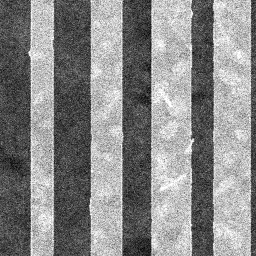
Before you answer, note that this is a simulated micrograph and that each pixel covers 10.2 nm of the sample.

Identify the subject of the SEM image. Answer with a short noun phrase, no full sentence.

one or a few lines or trenches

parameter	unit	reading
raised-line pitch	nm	651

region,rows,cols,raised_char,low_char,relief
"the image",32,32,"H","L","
LLLLHHHLLLLHHHHLLLLHHHHHLLLHHHHL
LLLLHHHLLLLHHHHLLLLHHHHHLLLHHHHL
LLLLHHHLLLLHHHHLLLLHHHHHLLLHHHHL
LLLLHHHLLLLHHHHLLLLHHHHHLLLHHHHL
LLLLHHHLLLLHHHHLLLLHHHHHLLLHHHHL
LLLLHHLLLLLHHHHLLLLHHHHHLLLHHHHL
LLLLHHHLLLLHHHHLLLLHHHHHLLLHHHHL
LLLLHHHLLLLHHHHLLLLHHHHHLLLHHHHL
LLLLHHHLLLLHHHHLLLLHHHHHLLLHHHHL
LLLLHHHLLLLHHHHLLLLHHHHHLLLHHHHL
LLLLHHHLLLLHHHHLLLLHHHHHLLLHHHHL
LLLLHHHLLLLHHHHLLLLHHHHHLLLHHHHL
LLLLHHHLLLLHHHHLLLLHHHHHLLLHHHHL
LLLLHHHLLLLHHHHLLLLHHHHHLLLHHHHL
LLLLHHHLLLLHHHHLLLLHHHHHLLLHHHHL
LLLLHHHLLLLHHHHLLLLHHHHHLLLHHHHL
LLLLHHHLLLLHHHHLLLLHHHHHLLLHHHHL
LLLLHHHLLLLHHHHLLLLHHHHHLLLHHHHL
LLLLHHHLLLLHHHHLLLLHHHHHLLLHHHHL
LLLLHHHLLLLHHHHLLLLHHHHHLLLHHHHL
LLLLHHHLLLLHHHHLLLLHHHHHLLLHHHHL
LLLLHHHLLLLHHHHLLLLHHHHHLLLHHHHL
LLLLHHHLLLLHHHHLLLLHHHHHLLLHHHHL
LLLLHHHLLLLHHHHLLLLHHHHHLLLHHHHL
LLLLHHHLLLLHHHHLLLLHHHHHLLLHHHHL
LLLLHHHLLLLHHHHLLLLHHHHHLLLHHHHL
LLLLHHHLLLLHHHHLLLLHHHHHLLLHHHHL
LLLLHHHLLLLHHHHLLLLHHHHHLLLHHHHL
LLLLHHHLLLLHHHHLLLLHHHHHLLLHHHHL
LLLLHHHLLLLHHHHLLLLHHHHHLLLHHHHL
LLLLHHHLLLLHHHHLLLLHHHHHLLLHHHHL
LLLLHHHLLLLHHHHLLLLHHHHHLLLHHHHL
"